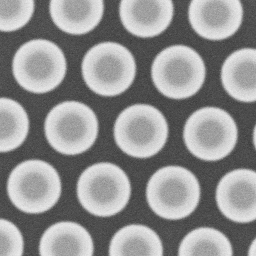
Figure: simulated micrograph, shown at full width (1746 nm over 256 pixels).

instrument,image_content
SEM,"an array of small figures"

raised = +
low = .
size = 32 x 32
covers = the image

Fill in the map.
++++..+++++++..++++++...++++++..
++++..+++++++..+++++++..++++++..
++++...+++++...++++++...++++++..
++.....+++++....+++++...++++++..
.................++......++++...
...++++......++.................
..++++++...+++++....++++.....+++
..++++++..+++++++..++++++...++++
..++++++..+++++++..+++++++..++++
..++++++..+++++++..+++++++..++++
..+++++....+++++...++++++...++++
....++......+++.....++++....++++
+.............................++
+++....++++.....+++.......+.....
+++...++++++...+++++....+++++...
++++..++++++..+++++++..++++++...
+++...++++++..+++++++..+++++++..
+++...++++++..+++++++..+++++++..
++.....++++....+++++...++++++...
.................++......+++....
...+++......++..................
..+++++....++++.....++++.....+++
.++++++...++++++...++++++...++++
.+++++++..++++++..+++++++..+++++
.++++++...++++++..+++++++..+++++
..+++++...++++++...++++++..+++++
...++......++++....+++++....++++
+............................+++
++....++++.....++++.............
+++..++++++...++++++...+++++....
+++..+++++++..++++++...++++++...
+++..+++++++..++++++..+++++++..+